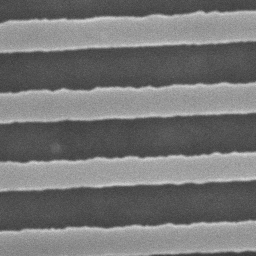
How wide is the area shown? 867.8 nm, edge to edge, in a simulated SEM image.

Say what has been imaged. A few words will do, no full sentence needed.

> lines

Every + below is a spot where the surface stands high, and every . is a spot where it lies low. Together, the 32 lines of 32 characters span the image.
................................
.............................+++
.......+..++++++++++++++++++++++
++++++++++++++++++++++++++++++++
++++++++++++++++++++++++++++++++
+++++++++++++++++++++++++.......
++..............................
................................
................................
................................
...........................++..+
...+++++++++++++++++++++++++++++
++++++++++++++++++++++++++++++++
++++++++++++++++++++++++++++++++
++++++++++++++++++++++..........
................................
................................
................................
................................
.....................++.++++++++
++++++++++++++++++++++++++++++++
++++++++++++++++++++++++++++++++
++++++++++++++++++++++++++++++++
++++++++........................
................................
................................
................................
................................
........+++++.++++++++++++++++++
++++++++++++++++++++++++++++++++
++++++++++++++++++++++++++++++++
++++++++++++++++++++++++.++.....